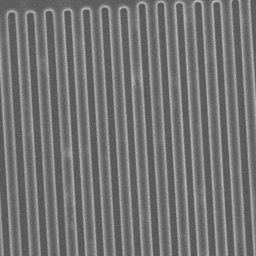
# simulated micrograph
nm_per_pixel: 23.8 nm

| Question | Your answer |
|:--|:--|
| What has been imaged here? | parallel lines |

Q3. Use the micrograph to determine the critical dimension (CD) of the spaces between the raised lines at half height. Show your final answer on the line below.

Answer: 176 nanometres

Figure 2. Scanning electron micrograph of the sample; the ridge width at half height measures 262 nm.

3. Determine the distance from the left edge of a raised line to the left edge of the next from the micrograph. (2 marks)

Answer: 0.445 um